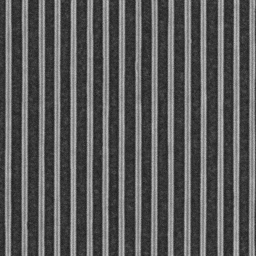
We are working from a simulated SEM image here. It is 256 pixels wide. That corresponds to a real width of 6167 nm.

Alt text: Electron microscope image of parallel lines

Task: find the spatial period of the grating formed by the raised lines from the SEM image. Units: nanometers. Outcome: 392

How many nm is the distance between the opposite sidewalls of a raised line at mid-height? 93.3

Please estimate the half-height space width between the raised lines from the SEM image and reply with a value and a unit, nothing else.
295 nm